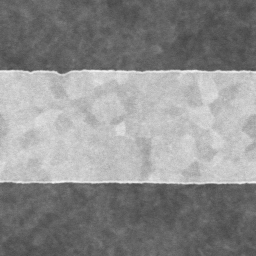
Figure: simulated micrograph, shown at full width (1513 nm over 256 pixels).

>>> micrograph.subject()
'one or a few lines or trenches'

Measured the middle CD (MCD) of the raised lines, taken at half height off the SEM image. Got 0.653 micrometres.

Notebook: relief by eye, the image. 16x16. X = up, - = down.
----------------
----------------
----------------
----------------
XXX-XXXX-XXXXXXX
XXXXXXXXXXXXXXXX
XXXXXXXXXXXXXXXX
XXXXXXXXXXXXXXXX
XXXXXXXXXXXXXXXX
XXXXXXXXXXXXXXXX
XXXXXXXXXXXXXXXX
----------------
----------------
----------------
----------------
----------------